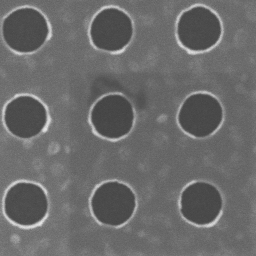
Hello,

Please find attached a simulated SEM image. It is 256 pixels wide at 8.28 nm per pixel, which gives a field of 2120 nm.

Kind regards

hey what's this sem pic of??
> a regular array of holes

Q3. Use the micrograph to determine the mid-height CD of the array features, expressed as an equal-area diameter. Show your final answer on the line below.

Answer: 0.356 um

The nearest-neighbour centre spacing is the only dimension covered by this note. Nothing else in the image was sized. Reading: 86.5 px